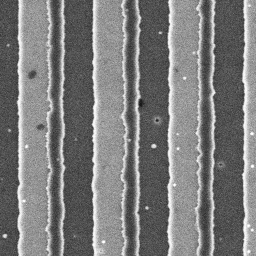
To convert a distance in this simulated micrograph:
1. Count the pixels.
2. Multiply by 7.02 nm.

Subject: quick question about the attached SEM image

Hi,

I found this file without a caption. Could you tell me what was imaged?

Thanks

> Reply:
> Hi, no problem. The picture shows lines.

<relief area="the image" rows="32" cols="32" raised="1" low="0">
00111111000011111000011111100001
00111111000011111000011111100001
00111111000011111000011111100001
00111111000011111000011111100001
00111111000011111000011111100001
00111111000011111000011111100001
00111111000011111000011111100001
00111111000011111000011111100001
00111111000011111000011111100001
00111111000011111000011111100011
00111111000011111000011111100011
00111111000011111000011111100001
00111111000011111000011111100001
00111111000011111000011111100011
00111111000011111000011111100001
00111111000011111000011111100001
00111111000011111000011111100001
00111111000011111000011111100001
00111111000011111000011111100001
00111111000011111000011111100001
00111111000011111000011111100001
00111111000011111000011111100011
00111111000011111000011111100011
00111111000011111000011111000001
00111111000011111000011111100001
00111111000011111000011111100001
00111111000011111000011111100001
00111111000011111000011111100001
00111111000011111000011111100001
00111111000011111000011111100001
00111111000011111000011111100001
00111111000011111000011111100001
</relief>